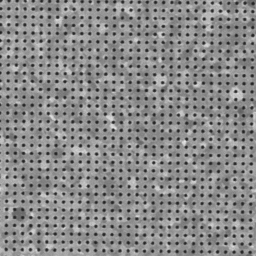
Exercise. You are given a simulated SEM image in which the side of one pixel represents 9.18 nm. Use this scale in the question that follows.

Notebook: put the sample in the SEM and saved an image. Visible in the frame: a regular array of holes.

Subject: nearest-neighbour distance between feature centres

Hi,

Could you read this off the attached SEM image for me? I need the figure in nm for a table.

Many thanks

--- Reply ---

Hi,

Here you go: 72.4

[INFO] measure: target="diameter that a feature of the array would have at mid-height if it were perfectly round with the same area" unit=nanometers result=32.8